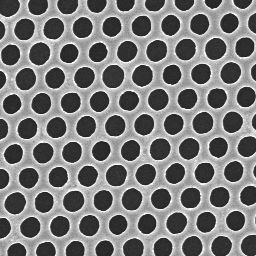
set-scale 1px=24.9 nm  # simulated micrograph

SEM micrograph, a regular array of holes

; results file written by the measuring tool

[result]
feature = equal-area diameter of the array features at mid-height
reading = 515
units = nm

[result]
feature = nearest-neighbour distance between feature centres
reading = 711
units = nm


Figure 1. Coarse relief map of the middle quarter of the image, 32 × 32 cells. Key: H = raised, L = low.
HHHHHHHHHHHLLLHHHHLLLHHHHHLLHHHH
HHHLLLLHHHLLLLLHHHLLLLHHHLLLLHHH
HHHLLLLLHHLLLLLHHLLLLLHHHLLLLHHH
HHHLLLLLHLLLLLLHHLLLLLHHHLLLLHHH
HHHLLLLHHHLLLLLHHLLLLLHHHLLLLHHH
HHHLLLHHHHHLLLHHHHHLHHHHHHHHHHHH
HHHHHHHHHHHHHHHHHHHHHHHLLHHHHHLL
HLLHHHHLLLLHHHHLLLHHHLLLLLHHHLLL
LLLLHHHLLLLHHHLLLLLHHLLLLLHHLLLL
LLLLHHLLLLLHHHLLLLLHHLLLLLHHLLLL
LLLLHHHLLLLHHHLLLLHHHLLLLLHHHLLL
LLLHHHHLLLHHHHHLLHHHHHLLHHHHHHHH
HHHHHHHHHHHHHHHHHHHHLHHHHHHLHHHH
HHHHLLLHHHHLLLLHHHLLLLHHHLLLLLHH
HHHLLLLLHHLLLLLHHHLLLLLHHLLLLLHH
LHHLLLLLHHLLLLLHHLLLLLLHHLLLLLHH
LHHLLLLLHHLLLLLHHHLLLLHHHLLLLLHH
HHHLLLLHHHHLLLHHHHHLLHHHHHLLHHHH
HHHHHHHHHHHHHHHHHHHHHHHHLHHHHHHL
HHLHHHHHLLLHHHHLLLHHHHLLLLHHHLLL
LLLLHHHLLLLLHHHLLLLHHHLLLLLHHLLL
LLLLLHHLLLLLHHLLLLLHHLLLLLLHHLLL
LLLLHHHLLLLLHHLLLLLHHHLLLLHHHLLL
LLLLHHHHLLLHHHHLLLHHHHLLLHHHHHLL
HLLHHHHHHHHHHHHHHHHHHHHHHHHHHHHH
HHHHHLLHHHHHLLLHHHHLLLHHHHLLLLHH
HHHHLLLLHHHLLLLLHHLLLLLHHHLLLLHH
LHHLLLLLHHLLLLLLHHLLLLLHHLLLLLHH
LHHLLLLLHHLLLLLHHHLLLLLHHLLLLLHH
LHHHLLLLHHHLLLLHHHHLLLHHHHLLLHHH
HHHHHLLHHHHHLLHHHHHHHHHHHHHHHHHH
HHHHHHHHHLHHHHHHLLHHHHHLLLHHHHLL